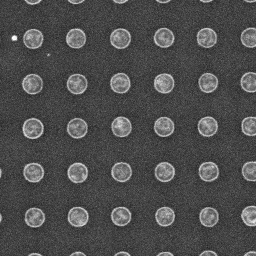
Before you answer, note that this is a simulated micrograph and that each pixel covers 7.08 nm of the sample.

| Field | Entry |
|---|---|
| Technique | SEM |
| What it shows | a regular array of raised bodies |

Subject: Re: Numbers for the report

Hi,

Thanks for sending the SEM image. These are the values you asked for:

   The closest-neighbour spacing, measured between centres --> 43.4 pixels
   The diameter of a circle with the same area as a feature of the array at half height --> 137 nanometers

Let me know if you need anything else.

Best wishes